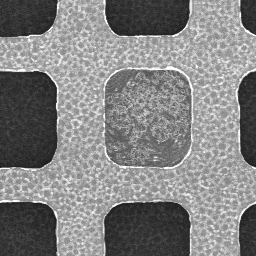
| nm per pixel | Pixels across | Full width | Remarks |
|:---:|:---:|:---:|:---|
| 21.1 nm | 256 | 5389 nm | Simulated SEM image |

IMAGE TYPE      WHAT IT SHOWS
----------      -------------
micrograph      holes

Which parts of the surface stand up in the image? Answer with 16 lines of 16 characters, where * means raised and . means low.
....***.....***.
...****.....***.
****************
****************
..*****....*****
....***.....***.
....***.....***.
....***.....***.
....***.....***.
...****.....***.
..**************
****************
****************
...****.....***.
....***.....***.
....***.....***.